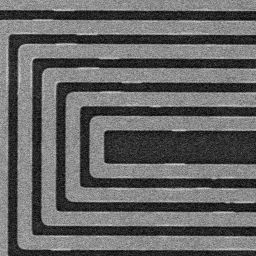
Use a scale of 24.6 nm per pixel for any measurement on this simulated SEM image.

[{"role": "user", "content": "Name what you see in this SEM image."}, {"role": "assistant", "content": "groups of lines, slits or small figures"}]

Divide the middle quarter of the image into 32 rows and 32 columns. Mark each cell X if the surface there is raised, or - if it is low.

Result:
--------------------------------
XXXXXXXXXXXXXXXXXXXXXXXXXXXXXXXX
XXXXXXXXXXXXXXXXXXXXXXXXXXXXXXXX
XXXXXXXXXXXXXXXXXXXXXXXXXXXXXXXX
--------------------------------
--------------------------------
--------------------------------
-XXXXXXXXXXXXXXXXXXXXXXXXXXXXXXX
-XXXXXXXXXXXXXXXXXXXXXXXXXXXXXXX
-XXXXXXXXXXXXXXXXXXXXXXXXXXXXXXX
-XXXX---------------------------
-XXX----------------------------
-XXX----------------------------
-XXX---XXXXXXXXXXXXXXXXXXXXXXXXX
-XXX---XXXXXXXXXXXXXXXXXXXXXXXXX
-XXX---XXXXXXXXXXXXXXXXXXXXXXXXX
-XXX---XXXX---------------------
-XXX---XXX----------------------
-XXX---XXX----------------------
-XXX---XXX----------------------
-XXX---XXX----------------------
-XXX---XXX----------------------
-XXX---XXX----------------------
-XXX--XXXX----------------------
-XXX--XXXX----------------------
-XXX--XXXXXXXXXXXXXXXXXXXXXXXXXX
-XXX--XXXXXXXXXXXXXXXXXXXXXXXXXX
-XXX---XXXXXXXXXXXXXXXXXXXXXXXXX
-XXX----------------------------
XXXX----------------------------
XXXX----------------------------
XXXXXXXXXXXXXXXXXXXXXXXXXXXXXXXX